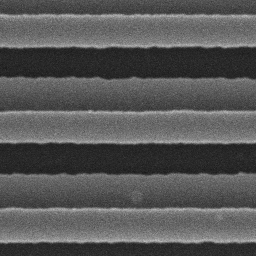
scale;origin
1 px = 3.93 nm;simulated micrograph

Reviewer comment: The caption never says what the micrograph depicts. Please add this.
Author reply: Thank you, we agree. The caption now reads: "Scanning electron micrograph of lines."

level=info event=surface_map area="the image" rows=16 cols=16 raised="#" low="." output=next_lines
################
################
################
................
................
################
################
################
################
................
................
################
################
################
################
................